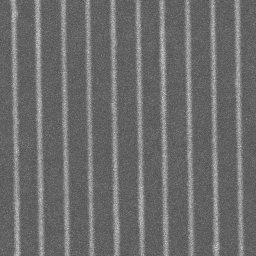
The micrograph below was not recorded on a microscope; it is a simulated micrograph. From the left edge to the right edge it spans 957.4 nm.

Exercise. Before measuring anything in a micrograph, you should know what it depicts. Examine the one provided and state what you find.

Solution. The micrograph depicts parallel lines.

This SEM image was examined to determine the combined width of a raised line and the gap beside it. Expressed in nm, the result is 92.9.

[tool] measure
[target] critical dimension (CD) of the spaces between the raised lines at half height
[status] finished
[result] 80.4 nm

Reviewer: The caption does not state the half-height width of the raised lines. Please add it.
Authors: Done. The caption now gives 14 nm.